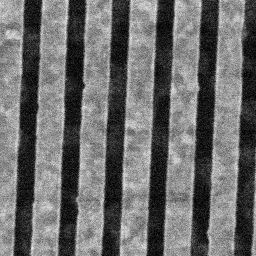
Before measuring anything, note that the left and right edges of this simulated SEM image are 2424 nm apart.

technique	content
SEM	parallel lines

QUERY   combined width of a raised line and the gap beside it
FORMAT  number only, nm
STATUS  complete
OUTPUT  418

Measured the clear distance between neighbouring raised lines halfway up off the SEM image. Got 180 nm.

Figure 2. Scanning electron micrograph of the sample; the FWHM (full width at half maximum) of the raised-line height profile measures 236 nm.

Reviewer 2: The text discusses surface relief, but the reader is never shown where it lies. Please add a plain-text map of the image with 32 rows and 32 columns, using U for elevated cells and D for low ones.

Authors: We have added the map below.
UUUDDUUUDDDUUUDDUUUUDDUUUDDUUUDD
UUUDDUUUDDDUUUDDUUUUDDUUUDDUUUUD
UUUDDUUUDDDUUUDDUUUDDDUUUDDUUUUU
UUUDDUUUDDDUUUDDUUUDDDUUUDDUUUUU
UUUDDUUUDDDUUUDDUUUDDDUUUDDUUUUD
UUUDDUUUDDDUUUDDUUUDDDUUUDDUUUDD
UUUDDUUUDDDUUUDDUUUDDDUUUDDUUUDD
UUUDDUUUDDDUUUDDUUUDDUUUUDDUUUDD
UUUDDUUUDDDUUUDDUUUDDDUUUDDUUUDD
UUUDDUUUDDDUUUDDUUUDDDUUUDDUUUDD
UUUDDUUUDDDUUUDDUUUDDDUUUDDUUUDD
UUUDDUUUDDUUUUUDUUUDDUUUUDDUUUDD
UUDDDUUUDDUUUUUDUUUDDUUUUDDUUUDD
UUDDDUUUDDUUUUUDUUUDDUUUUDDUUUDD
UUDDDUUUDDUUUDDDUUUDDUUUDDDUUUDD
UUDDDUUUDDUUUDDDUUUDDUUUDDDUUUDD
UUDDDUUUDDUUUDDDUUUDDUUUDDDUUUDD
UUDDDUUUDDUUUDDDUUUDDUUUDDDUUUDD
UUDDDUUUDDUUUDDDUUUDDUUUDDDUUUDD
UUDDDUUUDDUUUDDDUUUDDUUUDDDUUUDD
UUDDUUUUDDUUUDDDUUUDDUUUDDDUUUDD
UUDDUUUUDDUUUDDUUUUDDUUUDDDUUUDD
UUDDUUUUDDUUUDDUUUUDDUUUDDDUUUDD
UUDDUUUDDDUUUDDUUUUDDUUUDDUUUUDD
UUDDUUUDDDUUUDDUUUUDDUUUDDUUUDDD
UUDDUUUDDDUUUDDUUUDDDUUUDDUUUDDD
UUDDUUUDDDUUUDDUUUDDDUUUDDUUUDDD
UUDDUUUDDDUUUDDUUUDDDUUUDDUUUDDD
UUDDUUUDDDUUUDDUUUDDDUUUDDUUUDDD
UUDDUUUDDDUUUDDUUUDDDUUUDDUUUDDD
UUDDUUUDDDUUUDDUUUDDDUUUDDUUUUDD
UUDDUUUDDDUUUDDUUUDDDUUUDDUUUDDD